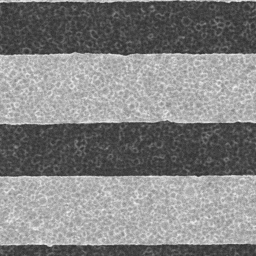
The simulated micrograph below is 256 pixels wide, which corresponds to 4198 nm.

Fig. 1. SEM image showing one or a few lines or trenches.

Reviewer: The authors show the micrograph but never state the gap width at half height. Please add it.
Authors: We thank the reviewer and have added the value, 871 nm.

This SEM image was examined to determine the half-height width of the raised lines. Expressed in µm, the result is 1.12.